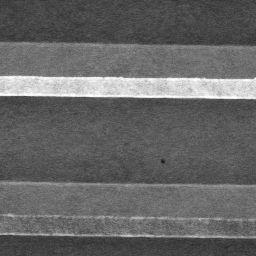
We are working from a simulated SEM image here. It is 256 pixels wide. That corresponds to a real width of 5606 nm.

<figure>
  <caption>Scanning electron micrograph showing lines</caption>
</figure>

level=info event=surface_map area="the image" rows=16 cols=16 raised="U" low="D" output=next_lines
DDDDDDDDDDDDDDDD
DDDDDDDDDDDDDDDD
DDDDDDDDDDDDDDDD
UUUUUUUUUUUUUUUU
UUUUUUUUUUUUUUUU
UUUUUUUUUUUUUUUU
DDDDDDDDDDDDDDDD
DDDDDDDDDDDDDDDD
DDDDDDDDDDDDDDDD
DDDDDDDDDDDDDDDD
DDDDDDDDDDDDDDDD
DDDDDDDDDDDDDDDD
UUUUUUUUUUUUUUUU
UUUUUUUUUUUUUUUU
UUUUUUUUUUUUUUUU
DDDDDDDDDDDDDDDD